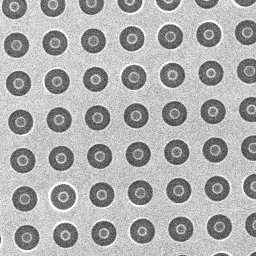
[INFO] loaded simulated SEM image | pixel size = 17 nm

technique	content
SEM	an array of small figures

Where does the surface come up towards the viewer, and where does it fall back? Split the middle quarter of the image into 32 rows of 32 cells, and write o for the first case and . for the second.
oooooooooooooooo...oooooo....ooo
oooooo....ooooo.....oooo......oo
.oooo......ooo...o...ooo..oo..oo
.oooo..oo..ooo..ooo..ooo...o..oo
..ooo..oo..ooo.......ooo......oo
.oooo......oooo.....ooooo....ooo
.ooooo....ooooooo.oooooooooooooo
oooooooooooooooooooooooooooooooo
oooooooooooooooooooooooooooooooo
oooooooooooooooooooooooooo...ooo
ooooooo...oooooo....ooooo.....oo
.ooooo.....oooo......oooo..o...o
..ooo...o..oooo..oo..ooo...oo..o
..ooo..ooo..ooo..oo..oooo......o
..ooo...o..oooo......oooo.....oo
..oooo.....ooooo....ooooooo..ooo
.oooooo...oooooooooooooooooooooo
oooooooooooooooooooooooooooooooo
oooooooooooooooooooooooooooooooo
ooooooooooooooooo...oooooo....oo
ooooooo....ooooo.....oooo......o
..oooo......oooo......ooo..oo..o
..oooo..oo..ooo..ooo..ooo..oo..o
...ooo..oo..ooo...o...ooo......o
...ooo......oooo.....ooooo....oo
..ooooo....oooooo...oooooooooooo
.ooooooooooooooooooooooooooooooo
oooooooooooooooooooooooooooooooo
oooooooooooooooooooooooooooo.ooo
ooooooooo.ooooooo....ooooo.....o
..ooooo.....oooo......oooo......
...ooo......oooo..oo..ooo...oo..